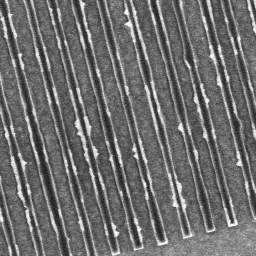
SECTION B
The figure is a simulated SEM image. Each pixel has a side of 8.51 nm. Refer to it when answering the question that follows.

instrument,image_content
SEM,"parallel lines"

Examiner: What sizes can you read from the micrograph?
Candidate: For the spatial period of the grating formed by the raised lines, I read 206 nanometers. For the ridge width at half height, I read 74.2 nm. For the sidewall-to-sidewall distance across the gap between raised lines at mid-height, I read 0.128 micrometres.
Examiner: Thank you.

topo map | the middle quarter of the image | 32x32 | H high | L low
HHLLLLHHLLLLHHLLLLLHHLLLLHHLLLLH
HHLLLLHHHLLLLHLLLLLHHHLLLLHHLLLH
LHLLLLHHHLLLLHHLLLLHHHLLLLHHLLLL
LHHLLLLHHLLLLHHLLLLLHHLLLLHHLLLL
LHHLLLLHHLLLLHHLLLLLHHLLLLHHLLLL
LHHLLLLHHHLLLLHHLLLLHHLLLLLHHLLL
LLHHLLLLHHLLLLHHLLLLHHHLLLLHHLLL
LLHHLLLLHHLLLLHHLLLLLHHLLLLHHLLL
LLHHLLLLHHLLLLHHLLLLLHHLLLLHHHLL
LLHHLLLLHHLLLLLHHLLLLHHHLLLLHHLL
LLHHHLLLLHHLLLLHHLLLLHHHLLLLHHLL
LLLHHLLLLHHLLLLHHLLLLLHHLLLLHHLL
LLLHHLLLLHHHLLLHHLLLLLHHLLLLHHLL
LLLHHHLLLHHHLLLLHHLLLLHHHLLLLHHL
LLLHHHLLLHHHLLLLHHLLLLLHHLLLLHHL
LLLHHHHLLLHHLLLLHHLLLLLHHLLLLHHL
LLLHHHHLLLHHLLLLHHLLLLLHHLLLLHHH
LLLHHHLLLLHHHLLLLHHLLLLHHLLLLLHH
HLLLHHHLLLHHHLLLLHHLLLLLHHLLLLHH
HLLLLHHLLLLHHLLLLHHLLLLLHHLLLLHH
HLLLLHHLLLLHHLLLLHHLLLLLHHLLLLLH
HHLLLHHHLLLHHHLLLHHHLLLLHHLLLLLH
HHLLLHHHLLLHHHLLLLHHLLLLLHHLLLLH
HHLLLHHHLLLHHHLLLLHHLLLLLHHLLLLH
HHLLLLHHLLLLHHHLLLLHHLLLLHHLLLLH
HHHLLLHHLLLLHHHLLLLHHLLLLLHLLLLL
LHHLLLHHHLLLHHHLLLLHHLLLLLHHLLLL
LHHLLLLHHLLLLHHLLLLHHLLLLLHHLLLL
LHHLLLLHHLLLLHHLLLLLHHLLLLHHLLLL
LHHHLLLHHHLLLHHLLLLLHHLLLLLHHLLL
LLHHLLLHHHLLLHHHLLLLHHLLLLLHHLLL
LLHHLLLLHHLLLLHHLLLLHHLLLLLHHLLL